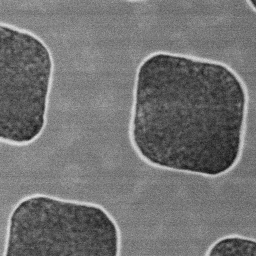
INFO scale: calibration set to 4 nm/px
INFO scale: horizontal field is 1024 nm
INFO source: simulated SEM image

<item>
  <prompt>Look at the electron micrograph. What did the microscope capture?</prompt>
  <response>holes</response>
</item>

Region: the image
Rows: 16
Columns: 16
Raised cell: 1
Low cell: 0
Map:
1111111111111111
1111111111111111
0011111111111111
0001111111011111
0001111110000011
0001111110000001
0001111100000001
0001111100000001
0011111100000001
1111111110000001
1111111111100011
1111111111111111
1100111111111111
1000000111111111
1000000111111111
0000000111111000